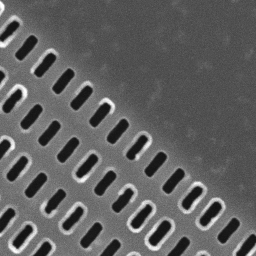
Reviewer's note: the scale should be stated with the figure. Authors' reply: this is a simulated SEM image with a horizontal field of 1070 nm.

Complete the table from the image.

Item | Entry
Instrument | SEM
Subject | a regular array of holes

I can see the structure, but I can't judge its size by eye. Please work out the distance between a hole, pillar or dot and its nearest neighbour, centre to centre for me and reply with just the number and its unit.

103 nm